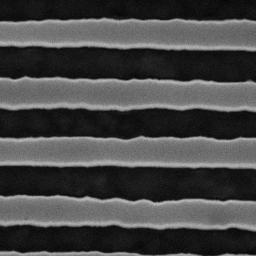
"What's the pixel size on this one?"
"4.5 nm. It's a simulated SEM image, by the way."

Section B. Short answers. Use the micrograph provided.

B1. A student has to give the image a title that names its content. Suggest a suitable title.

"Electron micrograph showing lines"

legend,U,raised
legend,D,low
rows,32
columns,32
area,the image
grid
DDDDDDDDDDDDDDDDDDDDDDDDDDDDDDDD
DDDDDDDDDDDDDDDDDDDDDDDDDDDDDDDD
DDDDDUUUUUUUUUUUUUUUDUUUDDDDUUUD
UUUUUUUUUUUUUUUUUUUUUUUUUUUUUUUU
UUUUUUUUUUUUUUUUUUUUUUUUUUUUUUUU
UUUUUUUUUUUUUUUUUUUUUUUUUUUUUUUU
DDDDDDDDDDDDDDDDDDDDDDDDDDDDDDDD
DDDDDDDDDDDDDDDDDDDDDDDDDDDDDDDD
DDDDDDDDDDDDDDDDDDDDDDDDDDDDDDDD
DDDDDDDDDDDDDDDDDDDDDDDDDDDDDDDD
UUUUUUUUUUUUUUUUUUUUUUUUUUUUUUUU
UUUUUUUUUUUUUUUUUUUUUUUUUUUUUUUU
UUUUUUUUUUUUUUUUUUUUUUUUUUUUUUUU
UUUUUUUDDUUUUUUUUUUDUUUUUUUUUUUU
DDDDDDDDDDDDDDDDDDDDDDDDDDDDDDDD
DDDDDDDDDDDDDDDDDDDDDDDDDDDDDDDD
DDDDDDDDDDDDDDDDDDDDDDDDDDDDDDDD
UUUUUUUUUUUUUUUUUUUUUUUUUUUDDUUU
UUUUUUUUUUUUUUUUUUUUUUUUUUUUUUUU
UUUUUUUUUUUUUUUUUUUUUUUUUUUUUUUU
UUUUUUUUUUUUUUUUUUUUUUUUUUUUUUUU
DDDDDDDDDDDDDDDDDDDDDDDDDDDDDDDD
DDDDDDDDDDDDDDDDDDDDDDDDDDDDDDDD
DDDDDDDDDDDDDDDDDDDDDDDDDDDDDDDD
DDUUDDDUDDDDDDDDDDDDDDDDDDDDDDDD
UUUUUUUUUUUUUUUUUUUUUUUUUUUUUUUU
UUUUUUUUUUUUUUUUUUUUUUUUUUUUUUUU
UUUUUUUUUUUUUUUUUUUUUUUUUUUUUUUU
DDDDDDDDDDDDDDDDDDDUUDDDUUUUUDUU
DDDDDDDDDDDDDDDDDDDDDDDDDDDDDDDD
DDDDDDDDDDDDDDDDDDDDDDDDDDDDDDDD
UUDDDUDDDUUUUDDDDDDDDDDDDDDDDDDD